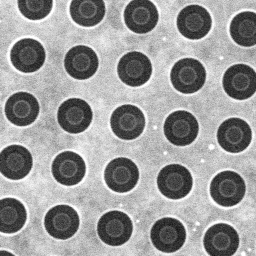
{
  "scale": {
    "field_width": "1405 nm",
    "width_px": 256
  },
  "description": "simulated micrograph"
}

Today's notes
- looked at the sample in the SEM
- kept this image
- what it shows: an array of small figures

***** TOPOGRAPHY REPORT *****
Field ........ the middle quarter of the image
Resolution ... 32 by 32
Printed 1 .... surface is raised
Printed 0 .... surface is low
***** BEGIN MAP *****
00111100011110001111001111100000
00011000111110001111001111100011
10000000111110001110001111000111
11000001111111000000001111000111
11111111111111000000011111100011
11111111111111110000111111100000
11111111111111111111111111110000
11111111111111111111111111111100
11001111111111111111111111111111
00000011111111111111111111111111
00000001111111000011111111111111
01110001111100000001111111110011
01111001111100000000111111000000
01111001111000111100111110000000
00110001111000111100011110001110
00000011111000111100111110011110
00000011111100000000111110011110
11011111111100000001111110001110
11111111111110000011111110000000
11111111111111111111111111000000
11111111111111111111111111110001
11111111111111111111111111111111
00001111111111111111111111111111
00000111111110001111111111111111
11000111111000000011111111111111
11100011110000000011111110000011
11100011110001110001111100000001
11100011110011110001111000010000
00000111110011110001111000111000
00001111110001110001111000111100
00011111111000000011111000111000
11111111111100000111111100000000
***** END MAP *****